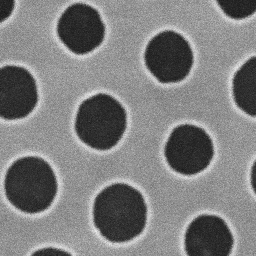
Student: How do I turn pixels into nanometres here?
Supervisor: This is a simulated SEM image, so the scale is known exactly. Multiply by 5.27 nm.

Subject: holes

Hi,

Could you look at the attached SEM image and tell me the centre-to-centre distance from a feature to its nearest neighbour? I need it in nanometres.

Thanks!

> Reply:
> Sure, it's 487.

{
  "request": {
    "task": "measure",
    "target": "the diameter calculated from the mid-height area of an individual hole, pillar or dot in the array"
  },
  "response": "280 nm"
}